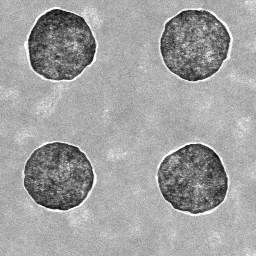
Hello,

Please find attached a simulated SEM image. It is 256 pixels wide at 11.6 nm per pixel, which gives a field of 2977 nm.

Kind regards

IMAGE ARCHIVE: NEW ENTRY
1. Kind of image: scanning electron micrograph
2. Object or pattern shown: holes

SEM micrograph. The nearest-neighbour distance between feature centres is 1.54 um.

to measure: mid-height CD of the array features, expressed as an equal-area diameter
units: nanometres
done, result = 812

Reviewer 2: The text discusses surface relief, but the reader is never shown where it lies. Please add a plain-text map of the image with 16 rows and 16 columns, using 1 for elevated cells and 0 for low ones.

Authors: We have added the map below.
1111111111111111
1100011111000011
1100001111000011
1100001111000011
1100011111100111
1111111111111111
1111111111111111
1111111111111111
1111111111111111
1100011111100111
1100001111000011
1100001111000011
1100011111000011
1111111111111111
1111111111111111
1111111111111111